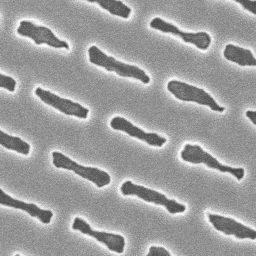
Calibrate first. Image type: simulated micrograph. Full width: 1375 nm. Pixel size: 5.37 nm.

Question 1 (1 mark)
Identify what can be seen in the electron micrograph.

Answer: a regular array of holes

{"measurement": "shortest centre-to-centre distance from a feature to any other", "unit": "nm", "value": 357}